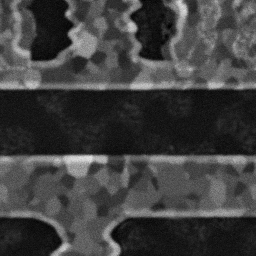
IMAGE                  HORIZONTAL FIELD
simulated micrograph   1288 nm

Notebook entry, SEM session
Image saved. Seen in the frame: one or a few lines or trenches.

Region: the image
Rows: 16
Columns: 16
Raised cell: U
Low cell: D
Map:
UDDDUUUUDDDUUUUU
UDDDDUUUDDDUUUUU
UDDDDUUUDDDUUUUU
UUDDUUUUUDDUUUUU
UUUUUUUUUUUUUUUU
DDDDDDDDDDDDDDDD
DDDDDDDDDDDDDDDD
DDDDDDDDDDDDDDDD
DDDDDDDDDDDDDDDD
DDDDDDDDDDDDDDDD
UUUUUUUUUUUUUUUU
UUUUUUUUUUUUUUUU
UUUUUUUUUUUUUUUU
DDUUUUUUDDDDDDDD
DDDDUUUDDDDDDDDD
DDDDUUUDDDDDDDDD